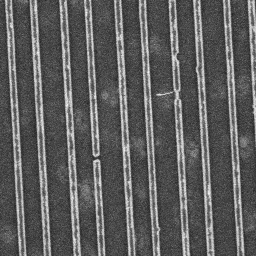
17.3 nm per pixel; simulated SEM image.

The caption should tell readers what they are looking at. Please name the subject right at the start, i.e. parallel lines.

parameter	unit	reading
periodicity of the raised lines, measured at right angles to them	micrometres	0.471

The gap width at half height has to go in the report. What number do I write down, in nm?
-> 335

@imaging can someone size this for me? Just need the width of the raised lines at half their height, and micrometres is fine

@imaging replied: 0.0886